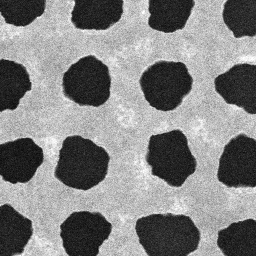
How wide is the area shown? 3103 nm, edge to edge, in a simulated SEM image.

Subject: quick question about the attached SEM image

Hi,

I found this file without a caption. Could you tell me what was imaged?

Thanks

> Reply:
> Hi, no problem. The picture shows holes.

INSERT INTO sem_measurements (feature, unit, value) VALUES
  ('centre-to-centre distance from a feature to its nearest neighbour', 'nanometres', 917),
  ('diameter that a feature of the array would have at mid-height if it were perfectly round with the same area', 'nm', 617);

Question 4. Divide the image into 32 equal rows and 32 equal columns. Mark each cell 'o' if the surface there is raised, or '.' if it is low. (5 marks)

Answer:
......ooo......oooo.....oooo....
.....oooo......oooo.....oooo....
o...ooooo......oooo....ooooo....
oooooooooo....ooooo....ooooo....
ooooooooooooooooooooooooooooo...
oooooooooooooooooooooooooooooooo
oooooooooooooooooooooooooooooooo
.ooooooooo..oooooooooooooooooooo
...oooooo....oooooo....oooooo...
....oooo......oooo......ooo.....
....oooo......ooo.......ooo.....
...ooooo......oooo......ooo.....
...oooooo....ooooo.....ooooo....
..ooooooooooooooooo...oooooooo..
oooooooooooooooooooooooooooooooo
oooooooooooooooooooooooooooooooo
ooooooooooooooooooooo..ooooooooo
oo..oooo...oooooooo....oooooo...
.....ooo.....ooooo......oooo....
.....oo.......oooo......oooo....
.....oo.......ooooo......oo.....
....ooo......oooooo.....ooo.....
o...ooo......ooooooo...oooo.....
ooooooooo..ooooooooooooooooooooo
oooooooooooooooooooooooooooooooo
oooooooooooooooooooooooooooooooo
..oooooooo.ooooooooooooooooooooo
....oooo.....oooo.......ooooooo.
....oooo......ooo........ooo....
....oooo......ooo........oo.....
...ooooo.....ooooo.......oo.....
...ooooo....oooooo......oooo....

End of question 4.